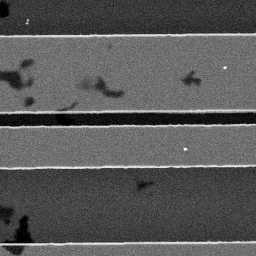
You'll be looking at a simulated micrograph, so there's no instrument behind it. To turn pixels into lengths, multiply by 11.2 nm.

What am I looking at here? lines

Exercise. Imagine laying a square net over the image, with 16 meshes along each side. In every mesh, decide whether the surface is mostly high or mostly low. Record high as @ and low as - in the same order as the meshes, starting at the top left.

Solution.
----------------
----------------
@@@@@@@@@@@@@@@@
@@@@@@@@@@@@@@@@
@@@@@@@@@@@@@@@@
@@@@@@@@@@@@@@@@
@@@@@@@@@@@@@@@@
@@@@@@@@@@@@@@@@
@@@@@@@@@@@@@@@@
@@@@@@@@@@@@@@@@
@@@@@@----------
----------------
----------------
----------------
----------------
@@@@@@@@@@@@@@@@